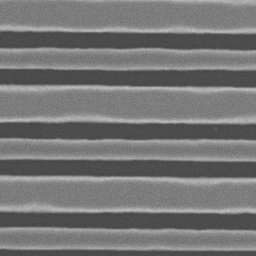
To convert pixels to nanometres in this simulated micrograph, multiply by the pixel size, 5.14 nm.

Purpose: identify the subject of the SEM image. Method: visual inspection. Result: lines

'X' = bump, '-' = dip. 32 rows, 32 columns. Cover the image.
XXXXXXXXXXXXXXXXXXXXXXXXXXXXXXXX
XXXXXXXXXXXXXXXXXXXXXXXXXXXXXXXX
XXXXXXXXXXXXXXXXXXXXXXXXXXXXXXXX
XXXXXXXXXXXXXXXXXXXXXXXXXXXXXXXX
--------------------------------
--------------------------------
XXXXXXXXXXXXXXXXXXXXXXXXXXXXXXXX
XXXXXXXXXXXXXXXXXXXXXXXXXXXXXXXX
XXXXXXXXXXXXXXXXXXXXXXXXXXXXXXXX
--------------------------------
--------------------------------
XXXXXXXXXXXXXXXXXXXXXXXXXXXXXXXX
XXXXXXXXXXXXXXXXXXXXXXXXXXXXXXXX
XXXXXXXXXXXXXXXXXXXXXXXXXXXXXXXX
XXXXXXXXXXXXXXXXXXXXXXXXXXXXXXXX
--------------------------------
--------------------------------
XXXXXXXXXXX-XXXX---XXXXXXXXXX-X-
XXXXXXXXXXXXXXXXXXXXXXXXXXXXXXXX
XXXXXXXXXXXXXXXXXXXXXXXXXXXXXXXX
--------------------------------
--------------------------------
XXXXXXXXXXXXXXXXXXXXXXXXXXXXXXXX
XXXXXXXXXXXXXXXXXXXXXXXXXXXXXXXX
XXXXXXXXXXXXXXXXXXXXXXXXXXXXXXXX
XXXXXXXXXXXXXXXXXXXXXXXXXXXXXXXX
------X-X-XX--XX--XXXXXXXXXXXXXX
--------------------------------
XXXXXXXXX-----------------------
XXXXXXXXXXXXXXXXXXXXXXXXXXXXXXXX
XXXXXXXXXXXXXXXXXXXXXXXXXXXXXXXX
--------------------------------